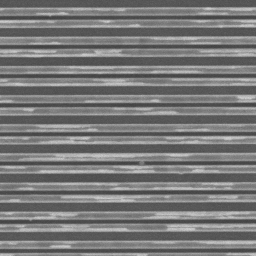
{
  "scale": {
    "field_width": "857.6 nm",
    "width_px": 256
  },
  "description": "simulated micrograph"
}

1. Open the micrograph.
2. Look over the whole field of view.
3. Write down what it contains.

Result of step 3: parallel lines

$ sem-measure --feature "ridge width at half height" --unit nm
24.3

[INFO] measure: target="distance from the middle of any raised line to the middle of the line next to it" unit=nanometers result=48.8